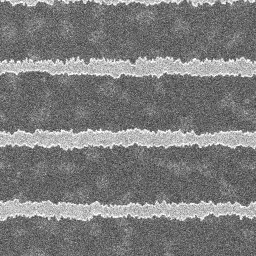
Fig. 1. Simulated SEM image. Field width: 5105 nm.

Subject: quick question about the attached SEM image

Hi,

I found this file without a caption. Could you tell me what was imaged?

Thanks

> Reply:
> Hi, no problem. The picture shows one or a few lines or trenches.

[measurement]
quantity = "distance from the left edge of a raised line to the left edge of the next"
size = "1420 nm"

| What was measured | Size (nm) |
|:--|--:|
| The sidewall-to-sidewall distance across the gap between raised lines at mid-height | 1150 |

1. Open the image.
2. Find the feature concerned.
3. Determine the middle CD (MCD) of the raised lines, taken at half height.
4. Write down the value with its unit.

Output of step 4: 257 nm